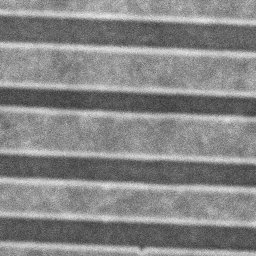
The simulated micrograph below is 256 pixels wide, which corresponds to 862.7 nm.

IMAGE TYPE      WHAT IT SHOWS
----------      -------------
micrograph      one or a few lines or trenches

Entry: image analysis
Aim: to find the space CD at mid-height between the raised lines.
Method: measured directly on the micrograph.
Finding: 96.3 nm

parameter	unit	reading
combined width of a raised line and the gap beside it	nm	223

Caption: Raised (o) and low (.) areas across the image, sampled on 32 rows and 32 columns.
oooooooooooooooooooooooooooooooo
oooooooooooooooooooooooooooooooo
.......................ooooooooo
................................
................................
................................
ooooooooooooooooooooooooo.......
oooooooooooooooooooooooooooooooo
oooooooooooooooooooooooooooooooo
oooooooooooooooooooooooooooooooo
oooooooooooooooooooooooooooooooo
.....................ooooooooooo
................................
................................
oooooooooooooooooooooooo........
oooooooooooooooooooooooooooooooo
oooooooooooooooooooooooooooooooo
oooooooooooooooooooooooooooooooo
oooooooooooooooooooooooooooooooo
............oo.ooooooooooooooooo
................................
................................
o...............................
oooooooooooooooooooooooooooo....
oooooooooooooooooooooooooooooooo
oooooooooooooooooooooooooooooooo
oooooooooooooooooooooooooooooooo
..................oooooooooooooo
................................
................................
o...............................
oooooooooooooooooooooooooo......